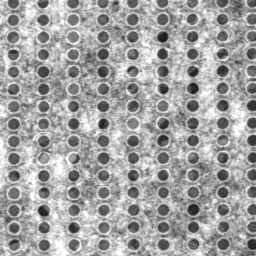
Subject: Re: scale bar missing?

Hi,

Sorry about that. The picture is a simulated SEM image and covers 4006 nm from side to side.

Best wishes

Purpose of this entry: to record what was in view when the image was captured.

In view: a regular array of raised bodies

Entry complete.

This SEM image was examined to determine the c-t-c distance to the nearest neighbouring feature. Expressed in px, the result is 17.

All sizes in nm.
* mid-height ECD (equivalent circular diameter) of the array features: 206